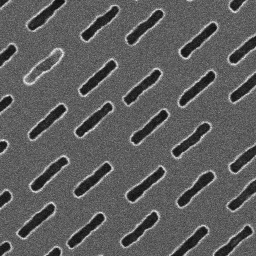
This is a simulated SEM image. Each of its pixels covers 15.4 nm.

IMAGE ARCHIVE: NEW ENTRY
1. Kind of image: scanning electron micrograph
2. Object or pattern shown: a regular array of holes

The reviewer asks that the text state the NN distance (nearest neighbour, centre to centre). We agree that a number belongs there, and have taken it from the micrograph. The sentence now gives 691 nm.